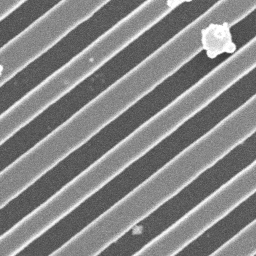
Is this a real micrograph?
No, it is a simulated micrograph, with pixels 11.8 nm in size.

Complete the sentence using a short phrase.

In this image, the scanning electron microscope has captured lines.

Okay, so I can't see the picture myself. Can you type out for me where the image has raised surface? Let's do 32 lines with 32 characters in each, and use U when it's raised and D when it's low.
UUUDDDDUUUUUUDDDDDUUUUDDDDDUUUUU
UDDDDDUUUUUUDDDDDUUUUDDDDDUUUUUD
DDDDDUUUUUUDDDDUUUUUDDDDUUUUUUDD
DDDUUUUUUDDDDDUUUUUDDDDUUUUUUDDD
DDUUUUUUDDDDDUUUUDDDDDUUUUUUUDDD
DUUUUUUDDDDUUUUUDDDDDUUUUUUUUDDU
UUUUUUDDDDUUUUUDDDDUUUUUUDUUUUUU
UUUUDDDDDUUUUDDDDDUUUUUUDDDDUUUU
UUUDDDDDUUUUDDDDDUUUUUDDDDDUUUUU
UUDDDDUUUUUDDDDDUUUUUDDDDDUUUUDD
DDDDDUUUUUDDDDUUUUUUDDDDDUUUUDDD
DDDDUUUUDDDDDUUUUUUDDDDUUUUUDDDD
DDDUUUUDDDDDUUUUUDDDDDUUUUUDDDDU
DUUUUUDDDDUUUUUUDDDDDUUUUDDDDDUU
UUUUUDDDDUUUUUUDDDDUUUUUDDDDDUUU
UUUDDDDDUUUUUDDDDDUUUUUDDDDUUUUU
UUDDDDDUUUUUDDDDDUUUUUDDDDUUUUUU
UDDDDUUUUUUDDDDUUUUUDDDDDUUUUUDD
DDDDUUUUUUDDDDUUUUUDDDDUUUUUUDDD
DDDUUUUUDDDDDUUUUUDDDDUUUUUUDDDD
DUUUUUUDDDDDUUUUDDDDDUUUUUUDDDDU
UUUUUUDDDDUUUUUDDDDDUUUUUDDDDDUU
UUUUUDDDDUUUUUDDDDUUUUUUDDDDDUUU
UUUDDDDDUUUUUDDDDUUUUUUDDDDDUUUU
UUDDDDDUUUUDDDDDUUUUUUDDDDUUUUUD
UDDDDUUUUUDDDDUUUUUUDDDDDUUUUUDD
DDDDUUUUUDDDDUUUUUUDDDDDUUUUUDDD
DDDUUUUDDDDDUUUUUUDDDDUUUUUDDDDD
DDUUUUDDDDDUUUUUDDDDDUUUUUDDDDDU
UUUUUDDDDUUUUUUDDDDDUUUUUDDDDUUU
UUUUDDDDUUUUUUDDDDUUUUUUDDDDUUUU
UUDDDDDUUUUUUDDDDUUUUUDDDDDUUUUU